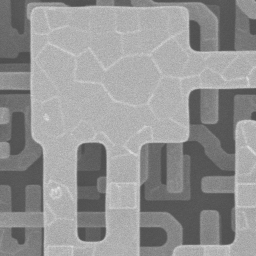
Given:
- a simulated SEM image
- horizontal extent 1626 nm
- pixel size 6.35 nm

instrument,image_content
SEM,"wiring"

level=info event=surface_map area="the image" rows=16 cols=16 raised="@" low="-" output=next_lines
--@@@@@@@@@-----
--@@@@@@@@@@----
--@@@@@@@@@@----
--@@@@@@@@@@@@@@
--@@@@@@@@@@@@@@
--@@@@@@@@@@@@@@
--@@@@@@@@@@----
--@@@@@@@@@@----
--@@@@@@@@@@---@
---@@--@@------@
---@@--@@------@
---@@--@@------@
---@@--@@------@
---@@--@@------@
---@@--@@------@
---@@@@@@--@@@@@